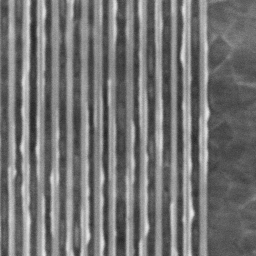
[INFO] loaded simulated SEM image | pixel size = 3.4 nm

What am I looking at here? parallel lines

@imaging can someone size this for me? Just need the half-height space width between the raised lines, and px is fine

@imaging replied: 8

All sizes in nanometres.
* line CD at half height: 21.3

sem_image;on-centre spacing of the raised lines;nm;50.2